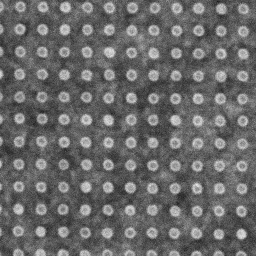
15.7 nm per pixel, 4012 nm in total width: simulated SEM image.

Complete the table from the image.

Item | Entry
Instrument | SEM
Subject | a regular array of raised bodies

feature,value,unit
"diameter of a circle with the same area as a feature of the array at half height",149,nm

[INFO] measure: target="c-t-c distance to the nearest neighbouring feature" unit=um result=0.343